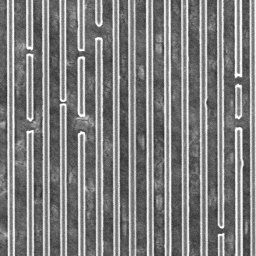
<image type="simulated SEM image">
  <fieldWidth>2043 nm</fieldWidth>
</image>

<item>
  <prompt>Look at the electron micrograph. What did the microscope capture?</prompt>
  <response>parallel lines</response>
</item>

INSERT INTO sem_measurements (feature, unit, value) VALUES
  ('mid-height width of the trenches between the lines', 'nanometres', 95.8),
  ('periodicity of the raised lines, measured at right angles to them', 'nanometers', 140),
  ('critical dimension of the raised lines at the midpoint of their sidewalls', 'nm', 47.9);